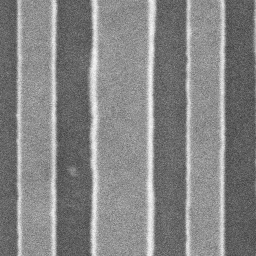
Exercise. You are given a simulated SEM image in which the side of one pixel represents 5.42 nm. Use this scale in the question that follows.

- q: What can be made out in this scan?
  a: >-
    lines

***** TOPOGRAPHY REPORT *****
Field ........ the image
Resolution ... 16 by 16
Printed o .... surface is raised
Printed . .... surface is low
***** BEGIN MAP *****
.oo...oooo..oo..
.oo...oooo..oo..
.oo...oooo..oo..
.oo...oooo..oo..
.oo...ooo...oo..
.oo...ooo...oo..
.oo...ooo...oo..
.oo...oooo..oo..
.oo...ooo...oo..
.oo...ooo...oo..
.oo...ooo...oo..
.oo...ooo...oo..
.oo...oooo..oo..
.oo...oooo..oo..
.oo...ooo...oo..
.oo...ooo...oo..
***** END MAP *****